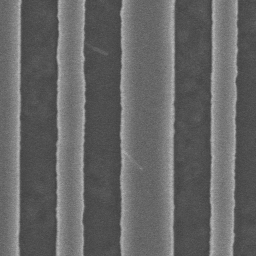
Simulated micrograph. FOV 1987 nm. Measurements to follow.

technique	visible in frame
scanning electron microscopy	lines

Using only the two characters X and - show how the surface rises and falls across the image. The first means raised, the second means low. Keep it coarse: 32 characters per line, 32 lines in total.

XXX----XXXX----XXXXXXX-----XXX--
XXX----XXXX----XXXXXXX-----XXX--
XXX----XXXX----XXXXXXX-----XXX--
XXX----XXXX----XXXXXXX-----XXX--
XXX----XXXX----XXXXXXX-----XXX--
XXX----XXX-----XXXXXXX-----XXX--
XXX----XXX-----XXXXXXX-----XXX--
XXX----XXXX----XXXXXXX-----XXX--
XXX----XXX-----XXXXXXX-----XXX--
XXX----XXXX----XXXXXXX----XXXX--
XXX----XXXX----XXXXXXX----XXX---
XX-----XXXX----XXXXXXX----XXXX--
XXX----XXXX----XXXXXXX----XXXX--
XXX----XXXX----XXXXXXX----XXX---
XX-----XXXX----XXXXXXX----XXX---
XX-----XXXX----XXXXXXX----XXX---
XX-----XXXX----XXXXXXX----XXX---
XX-----XXXX----XXXXXXX----XXX---
XX-----XXX-----XXXXXXX----XXX---
XX-----XXX-----XXXXXXX----XXX---
XX-----XXX-----XXXXXXX----XXX---
XX-----XXX-----XXXXXXX----XXX---
XX-----XXX-----XXXXXXX----XXX---
XX-----XXX-----XXXXXXX----XXX---
XX-----XXX-----XXXXXXX----XXX---
XX-----XXXX----XXXXXXX----XXX---
XX-----XXX-----XXXXXXX----XXX---
XX-----XXX-----XXXXXXX----XXX---
XX-----XXX-----XXXXXXX----XXX---
XX-----XXX-----XXXXXXX----XXX---
XX-----XXX-----XXXXXXX----XXX---
XX-----XXX-----XXXXXXX----XXX---